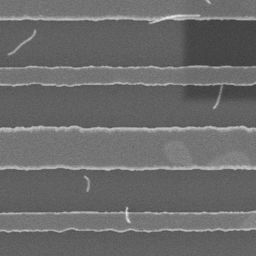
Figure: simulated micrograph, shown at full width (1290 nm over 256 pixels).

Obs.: lines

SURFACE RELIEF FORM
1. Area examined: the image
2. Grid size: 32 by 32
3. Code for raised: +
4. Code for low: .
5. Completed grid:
++++++++++++++++++++++++++++++++
++++++++++++++++++++++++++++++++
...................+............
................................
................................
................................
................................
................................
...++++++.++++++++++.+++++++++++
++++++++++++++++++++++++++++++++
++++.+++++++++++++++++++++++++++
................................
................................
................................
................................
................................
++++++++++++++++++++++++++++++++
++++++++++++++++++++++++++++++++
++++++++++++++++++++++++++++++++
++++++++++++++++++++++++++++++++
++++++++++++++++++++++++++++++++
................................
................................
................................
................................
................................
...............+...............+
++++++++++++++++++++++++++++++++
++++++++++++++++++++++++++++++++
................................
................................
................................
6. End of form